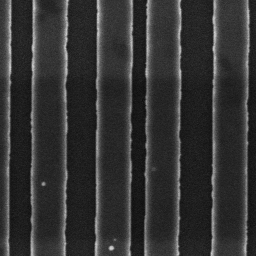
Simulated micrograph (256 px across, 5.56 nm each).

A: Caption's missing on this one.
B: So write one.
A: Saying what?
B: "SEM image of lines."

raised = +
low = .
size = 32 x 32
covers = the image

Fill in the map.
+...++++....+++++.+++++....++++.
+...++++....+++++.+++++....++++.
+...++++....+++++.+++++....++++.
+...++++....+++++.+++++....++++.
+...++++....+++++.++++.....++++.
+...++++....+++++.+++++....++++.
+...++++....+++++.+++++....++++.
+...++++....+++++.++++.....++++.
+...++++....+++++.+++++....++++.
+...++++....++++..+++++....++++.
+...++++....++++..+++++....++++.
+...++++....++++..+++++....++++.
+...++++....++++..+++++....++++.
+...++++....++++..++++.....++++.
+...++++....++++..++++.....++++.
+...++++....++++..++++.....++++.
+...++++....++++..++++.....++++.
+...++++....++++..++++.....++++.
+...++++....++++..++++.....++++.
+...++++....++++..++++.....++++.
+...++++....++++..++++.....++++.
+...++++....++++..++++.....++++.
+...++++....++++..++++.....++++.
+...++++....++++..++++.....++++.
+...++++....++++..++++.....++++.
+...++++....++++..++++.....++++.
+...++++....++++..++++.....++++.
+...++++....++++..++++.....++++.
+...++++....++++..++++.....++++.
+...++++....++++..++++.....++++.
+...++++....++++..++++.....++++.
+...++++....++++..++++....+++++.